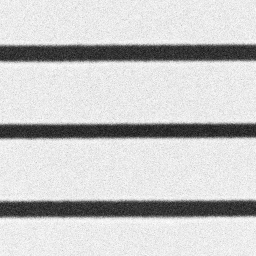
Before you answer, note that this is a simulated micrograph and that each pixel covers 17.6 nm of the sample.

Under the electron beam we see lines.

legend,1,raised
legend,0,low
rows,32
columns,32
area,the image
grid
11111111111111111111111111111111
11111111111111111111111111111111
11111111111111111111111111111111
11111111111111111111111111111111
11111111111111111111111111111111
11111111111110110100000000000000
00000000000000000000000000000000
00000000000000000000000000000000
11111111111111111111111111111111
11111111111111111111111111111111
11111111111111111111111111111111
11111111111111111111111111111111
11111111111111111111111111111111
11111111111111111111111111111111
11111111111111111111111111111111
00000000000000000000000000000000
00000000000000000000000000000000
11111111111111111111111111111111
11111111111111111111111111111111
11111111111111111111111111111111
11111111111111111111111111111111
11111111111111111111111111111111
11111111111111111111111111111111
11111111111111111111111111111111
11111111111111111111111111111111
00000000000000000000000000000000
00000000000000000000000000000000
11111111111111111111111111111111
11111111111111111111111111111111
11111111111111111111111111111111
11111111111111111111111111111111
11111111111111111111111111111111